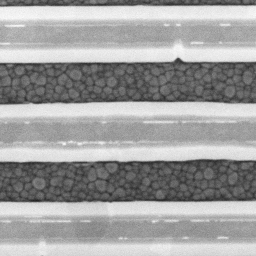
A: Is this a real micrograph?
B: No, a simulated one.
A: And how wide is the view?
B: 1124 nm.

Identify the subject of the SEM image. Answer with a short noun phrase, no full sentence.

one or a few lines or trenches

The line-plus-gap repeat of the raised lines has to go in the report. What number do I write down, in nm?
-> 430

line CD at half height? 177 nm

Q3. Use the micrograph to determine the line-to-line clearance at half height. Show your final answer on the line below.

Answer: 246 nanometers